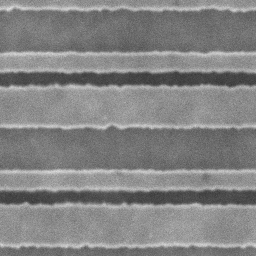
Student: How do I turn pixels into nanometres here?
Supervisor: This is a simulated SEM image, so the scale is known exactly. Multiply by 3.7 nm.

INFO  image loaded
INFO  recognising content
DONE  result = lines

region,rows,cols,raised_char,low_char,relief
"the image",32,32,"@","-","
@@@@@@@@@@@@@@@@@@@@@@@@@@@@@@@@
--------------------------------
--------------------------------
--------------------------------
--------------------------------
--------------------------------
-------------------@------------
@@@@@@@@@@@@@@@@@@@@@@@@@@@@@@@@
@@@@@@@@@@@@@@@@@@@@@@@@@@@@@@@@
--------------------------------
--------------------------------
@@@@@@@@@@@@@@@@@@@@@@@@@@@@@@@@
@@@@@@@@@@@@@@@@@@@@@@@@@@@@@@@@
@@@@@@@@@@@@@@@@@@@@@@@@@@@@@@@@
@@@@@@@@@@@@@@@@@@@@@@@@@@@@@@@@
@@@@@@@@@@@@@@@@@@@@@@@@@@@@@@@@
--------------------------------
--------------------------------
--------------------------------
--------------------------------
--------------------------------
@@@@@@@@@@@@@@@@@@@@@@@@@@@@@@@@
@@@@@@@@@@@@@@@@@@@@@@@@@@@@@@@@
@@@@@@@@@@@@@@@@@@@@@@@@@@@@@@@@
--------------------------------
---@----@@-----@--------@-------
@@@@@@@@@@@@@@@@@@@@@@@@@@@@@@@@
@@@@@@@@@@@@@@@@@@@@@@@@@@@@@@@@
@@@@@@@@@@@@@@@@@@@@@@@@@@@@@@@@
@@@@@@@@@@@@@@@@@@@@@@@@@@@@@@@@
@@@@@@@@@@@@@@@@@@@@@@@@@@@@@@@@
--------------------------------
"